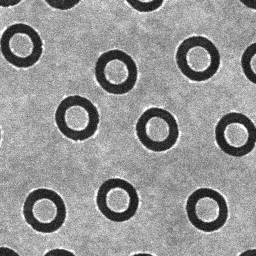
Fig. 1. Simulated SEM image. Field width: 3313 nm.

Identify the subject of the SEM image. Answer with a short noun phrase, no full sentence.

ring-shaped grooves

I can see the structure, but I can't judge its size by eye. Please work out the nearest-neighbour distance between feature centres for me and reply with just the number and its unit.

951 nanometers